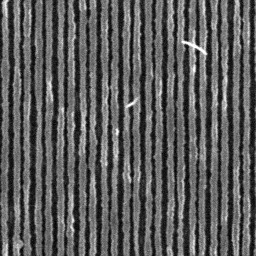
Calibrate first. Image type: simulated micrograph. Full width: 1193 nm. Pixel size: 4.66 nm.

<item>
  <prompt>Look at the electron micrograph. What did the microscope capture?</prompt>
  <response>parallel lines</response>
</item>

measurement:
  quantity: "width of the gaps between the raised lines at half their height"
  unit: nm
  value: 26.2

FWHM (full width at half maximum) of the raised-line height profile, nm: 26.2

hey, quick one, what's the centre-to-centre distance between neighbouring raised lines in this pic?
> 51.2 nm